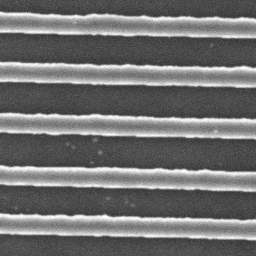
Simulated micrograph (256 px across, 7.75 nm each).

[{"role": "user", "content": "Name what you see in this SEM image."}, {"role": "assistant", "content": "lines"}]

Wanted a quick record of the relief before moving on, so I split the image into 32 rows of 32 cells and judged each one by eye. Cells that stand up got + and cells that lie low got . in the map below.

................................
................................
++++++++++++++++++++++++++++++++
++++++++++++++++++++++++++++++++
........................++++++++
................................
................................
................................
++++++++++++++++++++++++++++.++.
++++++++++++++++++++++++++++++++
..................++++++++++++++
................................
................................
................................
+++++++++++++++.................
++++++++++++++++++++++++++++++++
.+++++++++++++++++++++++++++++++
................................
................................
................................
................................
++++++++++++++++++++++++++++....
++++++++++++++++++++++++++++++++
..................++++++++++++++
................................
................................
................................
+++++++++++++++++++++++++++.....
++++++++++++++++++++++++++++++++
..................++++++++++++++
................................
................................